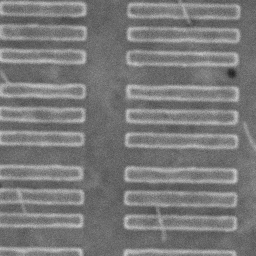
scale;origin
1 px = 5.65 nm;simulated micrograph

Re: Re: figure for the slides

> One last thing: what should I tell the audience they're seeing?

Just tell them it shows wiring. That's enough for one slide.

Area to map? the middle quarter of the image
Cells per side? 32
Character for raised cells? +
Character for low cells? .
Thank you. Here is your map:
................................
................................
................................
................................
................................
.++++...........................
+++++...........++++++++++++++++
+++++...........++++++++++++++++
....................++++++++++++
................................
................................
..+++...........................
+++++...........++++++++++++++++
+++++...........++++++++++++++++
.....................+++...+++++
................................
................................
++++............+++++++++.......
+++++...........++++++++++++++++
+++++...........++++++++++++++++
.....................++++++++++.
................................
................................
................................
................................
................................
++++............++++++++....++++
++++...........+++++++++++++++++
++++...........+++++++++++++++++
................................
................................
................................